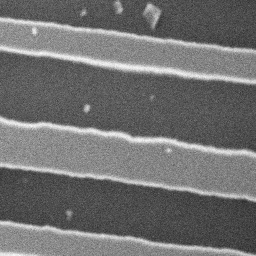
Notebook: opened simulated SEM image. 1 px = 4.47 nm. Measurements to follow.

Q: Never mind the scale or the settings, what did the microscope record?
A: lines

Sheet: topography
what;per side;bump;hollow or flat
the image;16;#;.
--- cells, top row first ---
................
###.............
##########......
....############
...........#####
................
................
................
########........
###############.
.###############
.........#######
................
................
#####...........
#############...